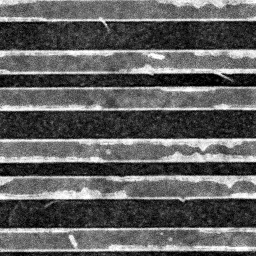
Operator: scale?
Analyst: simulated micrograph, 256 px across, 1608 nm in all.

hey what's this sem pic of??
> parallel lines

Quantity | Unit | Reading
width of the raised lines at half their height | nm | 136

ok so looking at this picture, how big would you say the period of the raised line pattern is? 279 nanometers